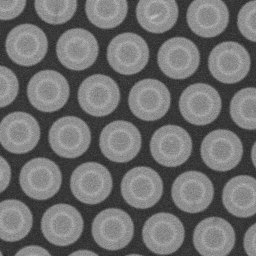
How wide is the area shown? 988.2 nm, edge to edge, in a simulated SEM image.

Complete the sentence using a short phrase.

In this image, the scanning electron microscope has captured an array of small figures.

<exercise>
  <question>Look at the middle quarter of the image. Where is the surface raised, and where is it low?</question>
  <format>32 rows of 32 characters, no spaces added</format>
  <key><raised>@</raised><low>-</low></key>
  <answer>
@@@@@@@-----@@@@@@@@----@@@@@@@@
---@---------@@@@@@-----@@@@@@@@
---------------@@@-------@@@@@@@
------@@@@@@---------------@@@--
@----@@@@@@@@------@@@@@--------
@---@@@@@@@@@----@@@@@@@@------@
@---@@@@@@@@@@---@@@@@@@@@----@@
@---@@@@@@@@@@--@@@@@@@@@@---@@@
@--@@@@@@@@@@@--@@@@@@@@@@@--@@@
@---@@@@@@@@@@--@@@@@@@@@@@--@@@
----@@@@@@@@@---@@@@@@@@@@---@@@
-----@@@@@@@@----@@@@@@@@@---@@@
------@@@@@------@@@@@@@@----@@@
@@@@---------------@@@@@------@@
@@@@@-------@@@@---------------@
@@@@@@-----@@@@@@@-------@@@@---
@@@@@@----@@@@@@@@-----@@@@@@@--
@@@@@@@--@@@@@@@@@@---@@@@@@@@@-
@@@@@@@--@@@@@@@@@@---@@@@@@@@@@
@@@@@@@--@@@@@@@@@@---@@@@@@@@@@
@@@@@@---@@@@@@@@@@--@@@@@@@@@@@
@@@@@@---@@@@@@@@@@---@@@@@@@@@@
@@@@@-----@@@@@@@@----@@@@@@@@@@
-----------@@@@@@@----@@@@@@@@@-
--------------@--------@@@@@@@--
----@@@@@@---------------@@@@---
---@@@@@@@@-----@@@@@@----------
--@@@@@@@@@@---@@@@@@@@@-----@@@
--@@@@@@@@@@---@@@@@@@@@----@@@@
--@@@@@@@@@@--@@@@@@@@@@@---@@@@
--@@@@@@@@@@--@@@@@@@@@@@--@@@@@
--@@@@@@@@@@--@@@@@@@@@@@--@@@@@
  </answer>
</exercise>